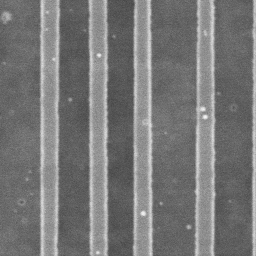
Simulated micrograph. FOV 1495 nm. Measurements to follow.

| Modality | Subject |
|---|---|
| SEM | lines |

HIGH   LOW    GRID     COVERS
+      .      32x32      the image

.....++....++....++......++.....
.....++....++....++......++.....
.....++....++....++......++.....
.....++....++....++......++.....
.....++....++....++......++.....
.....++....++....++......++.....
.....++....++....++......++.....
.....++....++....++......++.....
.....++....++....++......++.....
.....++....++....++......++.....
.....++....++....++......++.....
.....++....++....++......++.....
.....++....++....++......++.....
.....++....++....++......++.....
.....++....++....++......++.....
.....++....++....++......++.....
.....++....++....++......++.....
.....++....++....++......++.....
.....++....++....++......++.....
.....++....++....++......++.....
.....++....++....++......++.....
.....++....++....++......++.....
.....++....++....++......++.....
.....++....++....++......++.....
.....++....++....++......++.....
.....++....++....++......++.....
.....++....++....++......++.....
.....++....++....++......++.....
.....++....++....++......++.....
.....++....++....++.....+++.....
.....++....++....++.....+++.....
.....++....++....++.....+++.....